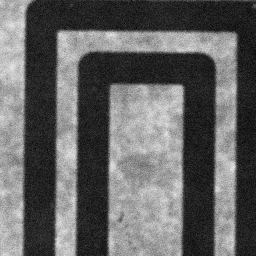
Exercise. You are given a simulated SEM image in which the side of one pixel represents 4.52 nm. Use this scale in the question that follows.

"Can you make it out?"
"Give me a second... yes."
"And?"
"groups of lines, slits or small figures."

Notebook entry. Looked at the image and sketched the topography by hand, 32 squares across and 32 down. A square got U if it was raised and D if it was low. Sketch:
UUUUDDDDDDDDDDDDDDDDDDDDDDDDDDDD
UUUDDDDDDDDDDDDDDDDDDDDDDDDDDDDD
UUUDDDDDDDDDDDDDDDDDDDDDDDDDDDDD
UUUDDDDDDDDDDDDDDDDDDDDDDDDDDDDD
UUUDDDDUUUUUUUUUUUUUUUUUUUUUUDDD
UUUDDDDUUUUUUUUUUUUUUUUUUUUUUDDD
UUUDDDDUUUUDDDDDDDDDDDDDDUUUUDDD
UUUDDDDUUUDDDDDDDDDDDDDDDDDUUDDD
UUUDDDDUUUDDDDDDDDDDDDDDDDDUUDDD
UUUDDDDUUUDDDDDDDDDDDDDDDDDUUDDD
UUUDDDDUUDDDDDDDDDDDDDDDDDDUUDDD
UUUDDDDUUDDDDDUUUUUUUUUDDDDUUDDD
UUUDDDDUUDDDDDUUUUUUUUUDDDDUUDDD
UUUDDDDUUDDDDDUUUUUUUUUDDDDUUDDD
UUUDDDDUUDDDDDUUUUUUUUUDDDDUUDDD
UUUDDDDUUDDDDDUUUUUUUUUDDDDUUDDD
UUUDDDDUUDDDDDUUUUUUUUUDDDDUUDDD
UUUDDDDUUDDDDDUUUUUUUUUDDDDUUDDD
UUUDDDDUUDDDDDUUUUUUUUUDDDDUUDDD
UUUDDDDUUDDDDDUUUUUUUUUDDDDUUDDD
UUUDDDDUUDDDDDUUUUUUUUUDDDDUUDDD
UUUDDDDUUDDDDDUUUUUUUUUDDDDUUDDD
UUUDDDDUUDDDDDUUUUUUUUUDDDDUUDDD
UUDDDDDUUDDDDDUUUUUUUUUDDDDUUDDD
UUUDDDDUUDDDDDUUUUUUUUUDDDDUUDDD
UUUDDDDUUDDDDDUUUUUUUUUDDDDUUDDD
UUUDDDDUUDDDDDUDUUUUUUUDDDDUUDDD
UUUDDDDUUDDDDDUUUUUUUUUDDDDUUDDD
UUUDDDDUUDDDDDUUUUUUUUUDDDDUUDDD
UUUDDDDUUDDDDDUUUUUUUUUDDDDUUDDD
UUUDDDDUUDDDDDUUDUUUUUUDDDDUUDDD
UUUDDDDUUDDDDDUUUUUUUUDDDDDUUDDD